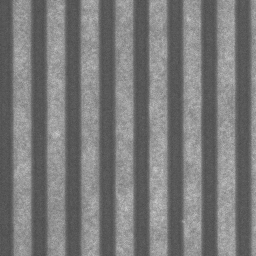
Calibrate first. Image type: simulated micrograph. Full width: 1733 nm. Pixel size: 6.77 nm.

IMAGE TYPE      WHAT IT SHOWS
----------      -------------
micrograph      parallel lines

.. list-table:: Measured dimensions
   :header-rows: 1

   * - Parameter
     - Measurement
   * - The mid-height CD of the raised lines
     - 19.5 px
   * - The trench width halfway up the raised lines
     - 0.0981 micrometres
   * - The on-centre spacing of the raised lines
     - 230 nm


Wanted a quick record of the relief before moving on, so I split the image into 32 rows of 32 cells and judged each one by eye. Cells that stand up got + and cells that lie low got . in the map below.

..++..++..++..+++..++..++..++..+
..++..++..++..+++..++..++..++..+
..++..++..++..+++..++..++..++..+
..++..++..++..+++..++..++..++..+
..++..++..++..+++..++..++..++..+
..++..++..++..+++..++..++..++..+
..++..++..++..+++..++..++..++..+
..++..++..++..+++..++..++..++..+
..++..++..++..+++..++..++..++..+
..++..++..++..+++..++..++..++..+
..++..++..++..+++..++..++..++..+
..++..++..++..+++..++..++..++..+
..++..++..++..+++..++..++..++..+
..++..++..++..+++..++..++..++..+
..++..++..++..+++..++..++..++..+
..++..++..++..+++..++..++..++..+
..++..++..++..+++..++..++..++..+
..++..++..++..+++..++..++..++..+
..++..++..++..+++..++..++..++..+
..++..++..++..+++..++..++..++..+
..++..++..++..+++..++..++..++..+
..++..++..++..+++..++..++..++..+
..++..++..++..+++..++..++..++..+
..++..++..++..+++..++..++..+++.+
..++..++..++..+++..++..++..+++.+
..++..++..++..+++..++..++..++..+
..++..++..++..+++..++..++..+++.+
..++..++..++..+++..++..++..+++.+
..++..++..++..+++..++..++..+++.+
..++..++..++..+++..++..++..+++.+
..++..++..++..+++..++..++..+++.+
..++..++..++..+++..++..++..+++.+